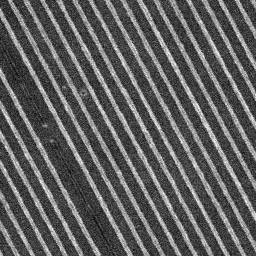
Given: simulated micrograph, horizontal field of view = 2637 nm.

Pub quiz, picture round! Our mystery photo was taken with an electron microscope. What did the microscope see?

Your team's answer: parallel lines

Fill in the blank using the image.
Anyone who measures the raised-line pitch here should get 147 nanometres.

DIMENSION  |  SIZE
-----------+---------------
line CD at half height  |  34.1 nm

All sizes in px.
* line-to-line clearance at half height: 10.9